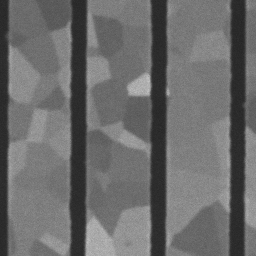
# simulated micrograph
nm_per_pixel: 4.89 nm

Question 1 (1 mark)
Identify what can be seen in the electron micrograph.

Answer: lines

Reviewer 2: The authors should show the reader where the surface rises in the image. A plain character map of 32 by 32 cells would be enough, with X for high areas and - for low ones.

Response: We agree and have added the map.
-XXXXXXXX--XXXXXXXX--XXXXXXXX--X
-XXXXXXXX--XXXXXXXX--XXXXXXXX--X
-XXXXXXXX--XXXXXXXX--XXXXXXXX--X
-XXXXXXXX--XXXXXXXX--XXXXXXXX--X
-XXXXXXXX--XXXXXXXX--XXXXXXXX--X
-XXXXXXXX--XXXXXXXX--XXXXXXXX--X
-XXXXXXXX--XXXXXXXX--XXXXXXXX--X
-XXXXXXXX--XXXXXXXX--XXXXXXXX--X
-XXXXXXXX--XXXXXXXX--XXXXXXXX--X
-XXXXXXXX--XXXXXXXX--XXXXXXXX--X
-XXXXXXXX--XXXXXXXX--XXXXXXXX--X
-XXXXXXXX--XXXXXXXX--XXXXXXXX--X
-XXXXXXXX--XXXXXXXX--XXXXXXXX--X
-XXXXXXXX--XXXXXXXX--XXXXXXXX--X
-XXXXXXXX--XXXXXXXX--XXXXXXXX--X
-XXXXXXXX--XXXXXXXX--XXXXXXXX--X
-XXXXXXXX--XXXXXXXX--XXXXXXXX--X
-XXXXXXXX--XXXXXXXX--XXXXXXXX--X
-XXXXXXXX--XXXXXXXX--XXXXXXXX--X
-XXXXXXXX--XXXXXXXX--XXXXXXXX--X
-XXXXXXXX--XXXXXXXX--XXXXXXXX--X
-XXXXXXXX--XXXXXXXX--XXXXXXXX--X
-XXXXXXXX--XXXXXXXX--XXXXXXXX--X
-XXXXXXXX--XXXXXXXX--XXXXXXXX--X
-XXXXXXXX--XXXXXXXX--XXXXXXXX--X
-XXXXXXXX--XXXXXXXX--XXXXXXXX--X
-XXXXXXXX--XXXXXXXX--XXXXXXXX--X
-XXXXXXXX--XXXXXXXX--XXXXXXXX--X
-XXXXXXXX--XXXXXXXX--XXXXXXXX--X
-XXXXXXXX--XXXXXXXX--XXXXXXXX--X
-XXXXXXXX--XXXXXXXX--XXXXXXXX--X
-XXXXXXXX--XXXXXXXX--XXXXXXXX--X